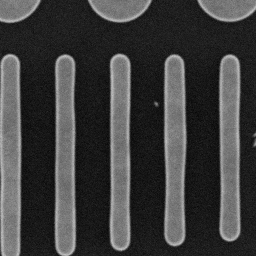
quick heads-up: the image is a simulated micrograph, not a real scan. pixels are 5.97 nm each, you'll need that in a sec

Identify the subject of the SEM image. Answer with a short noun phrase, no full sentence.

groups of lines, slits or small figures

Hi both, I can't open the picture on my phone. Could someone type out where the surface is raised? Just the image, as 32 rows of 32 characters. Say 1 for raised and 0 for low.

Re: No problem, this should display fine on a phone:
11111000000111111110000001111111
11110000000011111100000000111111
11100000000000110000000000011100
00000000000000000000000000000000
00000000000000000000000000000000
00000000000000000000000000000000
00000000000000000000000000000000
11000001100000110000011000001100
11000001100000110000011000001100
11000001100000110000011000011100
11000001100000110000011000011100
11000001100000110000011000011100
11000001100000110000011000011100
11000001100000110000011000011100
11100001100000110000011000001100
11100001100000110000011000001100
11100001100000110000011000001100
11100001100000110000011000001100
11100001100000110000011000001100
11100001100000110000011000001100
11100001100000110000011000001100
11100001100000110000011000001100
11100001100000110000011000001100
11100001100000110000011000001100
11100001100000110000011000001100
11100001100000110000011000001100
11100001100000110000011000001100
11100001100000110000011000001100
11000001100000110000011000011100
11000001100000110000011000001100
11000001100000110000011000000000
11000001100000000000000000000000